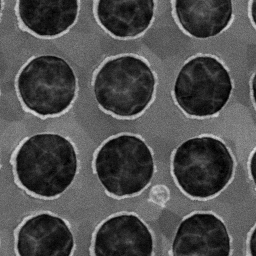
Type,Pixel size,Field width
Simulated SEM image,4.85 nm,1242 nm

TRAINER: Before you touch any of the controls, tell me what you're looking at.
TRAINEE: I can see holes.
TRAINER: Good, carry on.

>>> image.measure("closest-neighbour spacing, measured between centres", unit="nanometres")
378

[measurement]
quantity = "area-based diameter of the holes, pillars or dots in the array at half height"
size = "286 nanometers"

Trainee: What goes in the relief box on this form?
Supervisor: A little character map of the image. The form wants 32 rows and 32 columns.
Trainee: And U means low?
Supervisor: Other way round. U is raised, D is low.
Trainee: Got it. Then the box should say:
UUDDDDDDDDUUDDDDDDDUUUDDDDDDDUUU
UUDDDDDDDDUUDDDDDDDUUUDDDDDDDUUD
UUUDDDDDDUUUDDDDDDDUUUDDDDDDDUUU
UUUUDDDDUUUUUDDDDDUUUUUDDDDDUUUU
UUUUUUUUUUUUUUUDUUUUUUUUDDUUUUUU
UUUUUUUUUUUUUUUUUUUUUUUUUUUUUUUU
UUUUUUUUUUUUUUUUUUUUUUUUUUUUUUUU
UUUUDDDDUUUUUUDDDUUUUUUUDDDUUUUU
UUUDDDDDDUUUUDDDDDDUUUUDDDDDUUUU
UUDDDDDDDUUUDDDDDDDUUUDDDDDDDUUU
UUDDDDDDDUUUDDDDDDDUUUDDDDDDDUUU
UUDDDDDDDUUUDDDDDDDUUUDDDDDDDUUU
UUUDDDDDDUUUDDDDDDDUUUDDDDDDUUUU
UUUUDDDDUUUUUDDDDDUUUUUDDDDDUUUU
UUUUUUUUUUUUUUUUUUUUUUUUUDUUUUUU
UUUUUUUUUUUUUUUUUUUUUUUUUUUUUUUU
UUUUUUUUUUUUUUUUUUUUUUUUUUUUUUUU
UUUUDDDDUUUUUUDDDDUUUUUUDDDUUUUU
UUUDDDDDDUUUUDDDDDUUUUDDDDDDUUUU
UUDDDDDDDUUUDDDDDDDUUUDDDDDDDUUU
UUDDDDDDDDUUDDDDDDDUUUDDDDDDDUUD
UUDDDDDDDUUUDDDDDDDUUUDDDDDDDUUD
UUDDDDDDDUUUDDDDDDDUUUDDDDDDDUUU
UUUDDDDDUUUUUDDDDDUUUUUDDDDDUUUU
UUUUUDDUUUUUUUUUUUUUUUUUDDUUUUUU
UUUUUUUUUUUUUUUUUUUUUUUUUUUUUUUU
UUUUUUUUUUUUUUUUUUUUUUUUUUUUUUUU
UUUUDDDDUUUUUUDDDUUUUUUDDDDUUUUU
UUUDDDDDDUUUUDDDDDUUUUDDDDDDUUUU
UUDDDDDDDUUUDDDDDDDUUUDDDDDDDUUD
UUDDDDDDDUUUDDDDDDDUUUDDDDDDDUUD
UUDDDDDDDUUUDDDDDDDUUUDDDDDDDUUD